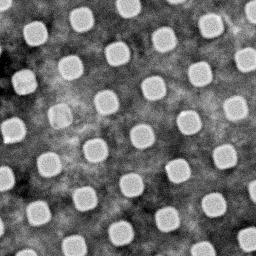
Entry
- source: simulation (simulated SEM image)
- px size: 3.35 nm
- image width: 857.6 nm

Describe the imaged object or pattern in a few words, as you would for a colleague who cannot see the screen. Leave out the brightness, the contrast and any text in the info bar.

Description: a regular array of raised bodies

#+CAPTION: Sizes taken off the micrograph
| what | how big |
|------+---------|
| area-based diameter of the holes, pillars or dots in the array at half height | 79 nm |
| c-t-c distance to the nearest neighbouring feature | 163 nm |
